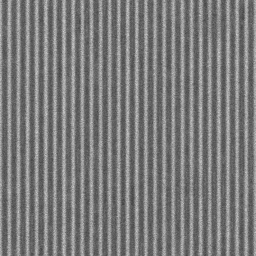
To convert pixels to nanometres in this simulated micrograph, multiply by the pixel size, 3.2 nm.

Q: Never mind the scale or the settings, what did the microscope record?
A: parallel lines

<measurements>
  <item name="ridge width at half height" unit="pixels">3.62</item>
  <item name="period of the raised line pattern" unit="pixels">9.12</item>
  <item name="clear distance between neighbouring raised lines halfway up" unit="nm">17.6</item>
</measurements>